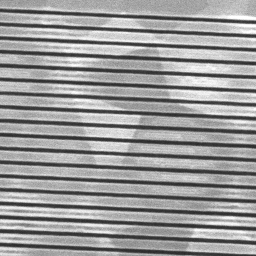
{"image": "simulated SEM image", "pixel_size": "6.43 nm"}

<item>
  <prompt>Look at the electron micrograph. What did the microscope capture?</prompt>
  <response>parallel lines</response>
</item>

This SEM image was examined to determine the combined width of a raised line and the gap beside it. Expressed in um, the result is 0.0884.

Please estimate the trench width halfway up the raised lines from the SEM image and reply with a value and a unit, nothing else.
30.5 nanometers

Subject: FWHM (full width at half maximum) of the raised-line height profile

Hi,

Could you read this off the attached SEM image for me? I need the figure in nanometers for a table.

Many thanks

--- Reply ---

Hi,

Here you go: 61